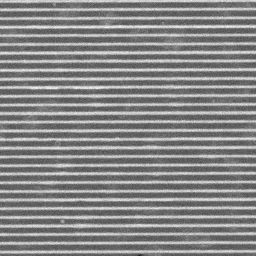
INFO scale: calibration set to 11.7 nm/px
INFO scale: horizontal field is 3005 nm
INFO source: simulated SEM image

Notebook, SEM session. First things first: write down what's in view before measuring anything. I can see parallel lines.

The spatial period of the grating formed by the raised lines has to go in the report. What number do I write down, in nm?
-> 102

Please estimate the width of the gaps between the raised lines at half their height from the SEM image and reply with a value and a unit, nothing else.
79.3 nm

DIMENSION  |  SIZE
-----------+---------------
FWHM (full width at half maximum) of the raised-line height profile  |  23.5 nm